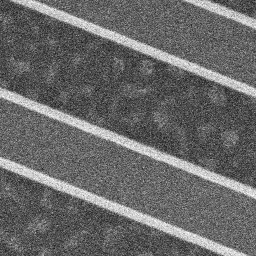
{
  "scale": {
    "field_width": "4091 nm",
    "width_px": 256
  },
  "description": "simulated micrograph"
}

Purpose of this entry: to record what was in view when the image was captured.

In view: one or a few lines or trenches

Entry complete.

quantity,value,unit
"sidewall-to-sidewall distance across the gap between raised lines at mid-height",1520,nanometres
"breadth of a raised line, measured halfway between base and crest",1000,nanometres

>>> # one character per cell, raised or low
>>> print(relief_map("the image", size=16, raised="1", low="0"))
0001111111111000
0000011111111111
0000000011111111
0000000000111111
0000000000000111
0000000000000001
1100000000000000
1111000000000000
1111111000000000
1111111110000000
0111111111110000
0000111111111100
0000001111111111
0000000001111111
0000000000011111
0000000000000011